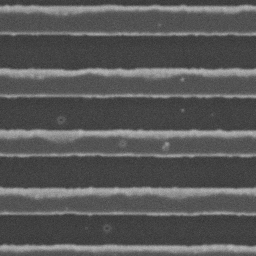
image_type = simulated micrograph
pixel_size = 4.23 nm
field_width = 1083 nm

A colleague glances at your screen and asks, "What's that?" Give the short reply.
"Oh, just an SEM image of lines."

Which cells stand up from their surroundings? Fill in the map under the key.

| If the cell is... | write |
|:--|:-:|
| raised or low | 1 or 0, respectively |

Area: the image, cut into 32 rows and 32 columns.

00000000000000000000000000000000
11111111111111111111111111111111
11111111111111111111111111111111
11111111111111111111111111111111
00000000000000000000000000000000
00000000000000000000000000000000
00000000000000000000000000000000
00000000000000000000000000000000
00000000000000000000000000000000
11111111111111111111111111111111
11111111111111111111111111111111
11111111111111111111111111111111
00000000000000000000000000000000
00000000000000000000000000000000
00000000000000000000000000000000
00000000000000000000000000000000
00000000000000000000000000000000
11111111111111111111111111111111
11111111111111111111111111111111
01110000000000000001111110000011
00000000000000000000000000000000
00000000000000000000000000000000
00000000000000000000000000000000
00000000000000000000000000000000
11111111111111111111111111111111
11111111111111111111111111111111
11111111111111111111111111111111
00000000000000000000000000000000
00000000000000000000000000000000
00000000000000000000000000000000
00000000000000000000000000000000
11111111111111111111111111111111